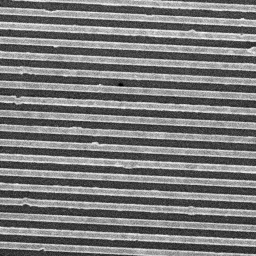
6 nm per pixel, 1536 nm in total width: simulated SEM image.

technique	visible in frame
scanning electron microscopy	parallel lines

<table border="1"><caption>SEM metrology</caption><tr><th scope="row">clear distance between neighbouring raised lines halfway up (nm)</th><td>53.2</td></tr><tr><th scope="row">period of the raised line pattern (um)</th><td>0.0878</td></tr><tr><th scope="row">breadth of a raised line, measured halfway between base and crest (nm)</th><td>36.7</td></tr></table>